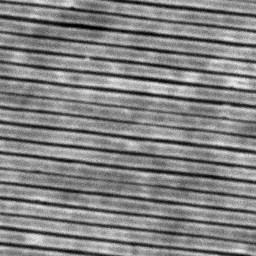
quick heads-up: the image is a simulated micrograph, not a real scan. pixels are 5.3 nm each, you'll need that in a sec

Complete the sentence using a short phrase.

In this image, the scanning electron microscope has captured parallel lines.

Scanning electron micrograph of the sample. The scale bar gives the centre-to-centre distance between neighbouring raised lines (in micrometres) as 0.0796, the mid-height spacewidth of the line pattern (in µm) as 0.0217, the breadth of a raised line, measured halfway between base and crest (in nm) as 57.9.